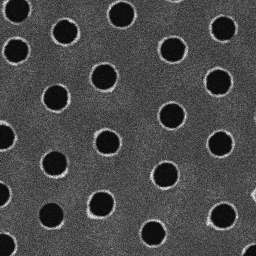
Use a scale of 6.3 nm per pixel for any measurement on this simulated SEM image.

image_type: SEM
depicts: a regular array of holes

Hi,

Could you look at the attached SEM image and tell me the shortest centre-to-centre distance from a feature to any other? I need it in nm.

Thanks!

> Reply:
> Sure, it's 340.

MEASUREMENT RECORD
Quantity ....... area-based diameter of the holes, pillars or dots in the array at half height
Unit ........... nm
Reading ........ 155